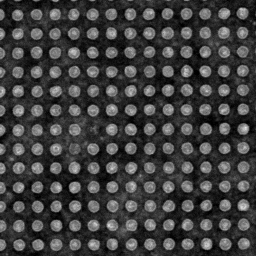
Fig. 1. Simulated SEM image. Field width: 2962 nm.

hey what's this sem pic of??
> a regular array of raised bodies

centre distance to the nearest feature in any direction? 215 nanometres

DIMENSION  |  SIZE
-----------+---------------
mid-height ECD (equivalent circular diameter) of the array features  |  130 nm